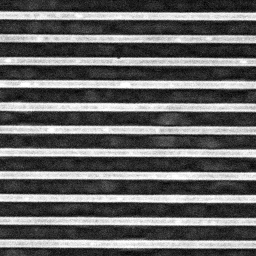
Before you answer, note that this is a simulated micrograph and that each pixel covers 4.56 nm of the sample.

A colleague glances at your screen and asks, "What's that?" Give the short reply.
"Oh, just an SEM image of parallel lines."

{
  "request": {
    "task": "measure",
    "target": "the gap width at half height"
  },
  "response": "0.0729 um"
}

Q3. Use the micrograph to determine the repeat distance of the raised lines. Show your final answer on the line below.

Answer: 104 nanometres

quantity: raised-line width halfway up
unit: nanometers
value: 31.9